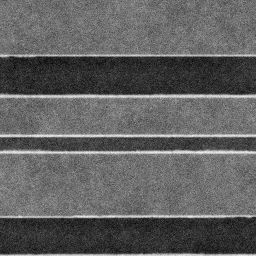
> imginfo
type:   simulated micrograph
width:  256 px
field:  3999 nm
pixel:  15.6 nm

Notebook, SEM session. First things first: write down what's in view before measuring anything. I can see lines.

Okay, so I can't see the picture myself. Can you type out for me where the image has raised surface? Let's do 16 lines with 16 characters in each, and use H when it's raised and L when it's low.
HHHHHHHHHHHHHHHH
HHHHHHHHHHHHHHHH
HHHHHHHHHHHHHHHH
LLLLLLLLLLLLLLLL
LLLLLLLLLLLLLLLL
LLLLLLLLLLLLLLLL
HHHHHHHHHHHHHHHH
HHHHHHHHHHHHHHHH
HHHHHHHHHHHHHHHH
HHHHHHHHHHHHHHHH
HHHHHHHHHHHHHHHH
HHHHHHHHHHHHHHHH
HHHHHHHHHHHHHHHH
HHHHHHHHHHHHHHHH
LLLLLLLLLLLLLLLL
LLLLLLLLLLLLLLLL